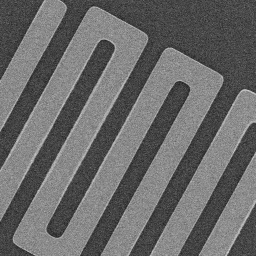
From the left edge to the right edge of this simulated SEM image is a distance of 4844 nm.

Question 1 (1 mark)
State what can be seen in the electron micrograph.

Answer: groups of lines, slits or small figures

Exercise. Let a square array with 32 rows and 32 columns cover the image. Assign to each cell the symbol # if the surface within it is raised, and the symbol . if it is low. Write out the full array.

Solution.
.....###........................
.....###...##...................
....####..#####.................
....###...#######...............
...####..#########..............
...###...###..####..............
..###...####..####..##..........
..###...###...###...####........
.###...###...####..#######......
####...###...###...#########....
###...###...###...####.#####....
###..####...###...###...###...#.
##...###...###...####..####..###
##..####...###...###...###...###
#...###...###...###...####..####
...####..####...###...###...###.
...###...###...###...###...####.
..###...####...###...###...###..
..###...###...###...###...###...
.###...###...####..####...###...
.###...###...###...###...###...#
###...###...####..####..####...#
###...###...###...###...###...##
##...###...####..####..####...##
##..####...###...###...###...###
#...###...###...####..####..####
#..####..####...###...###...###.
...###...###...###...####..####.
..####..####...###...###...###..
..####..###...###...####..####..
..#########..####...###...###...
....######...###...###...####...